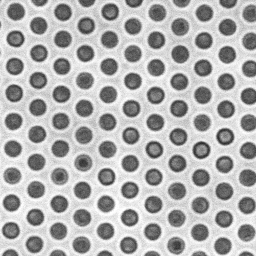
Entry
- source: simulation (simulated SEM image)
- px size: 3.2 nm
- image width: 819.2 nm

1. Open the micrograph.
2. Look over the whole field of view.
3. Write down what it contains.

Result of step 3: a regular array of holes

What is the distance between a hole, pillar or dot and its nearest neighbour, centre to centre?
86 nanometers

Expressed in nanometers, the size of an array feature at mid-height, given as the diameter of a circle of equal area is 57.7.